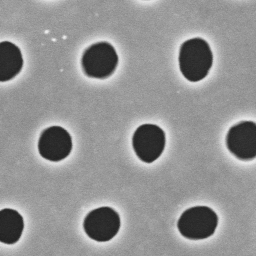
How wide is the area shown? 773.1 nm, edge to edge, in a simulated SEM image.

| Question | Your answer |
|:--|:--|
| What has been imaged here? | holes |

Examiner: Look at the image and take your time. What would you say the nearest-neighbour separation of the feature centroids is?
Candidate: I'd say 284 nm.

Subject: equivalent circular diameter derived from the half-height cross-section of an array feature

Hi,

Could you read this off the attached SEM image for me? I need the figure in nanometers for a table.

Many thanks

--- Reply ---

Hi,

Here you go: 110